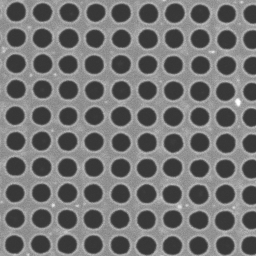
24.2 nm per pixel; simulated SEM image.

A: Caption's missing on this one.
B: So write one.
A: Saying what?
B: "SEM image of a regular array of holes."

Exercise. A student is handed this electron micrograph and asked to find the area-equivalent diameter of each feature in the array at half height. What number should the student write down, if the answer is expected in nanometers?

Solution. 471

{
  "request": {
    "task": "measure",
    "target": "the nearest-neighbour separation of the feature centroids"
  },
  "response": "0.614 µm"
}